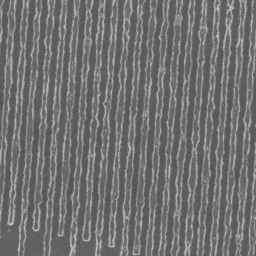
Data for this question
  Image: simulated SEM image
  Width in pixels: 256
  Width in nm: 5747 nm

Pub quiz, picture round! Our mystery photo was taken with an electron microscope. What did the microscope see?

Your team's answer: parallel lines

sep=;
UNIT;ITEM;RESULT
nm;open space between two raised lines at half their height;171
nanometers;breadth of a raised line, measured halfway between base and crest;115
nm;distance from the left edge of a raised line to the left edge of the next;286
